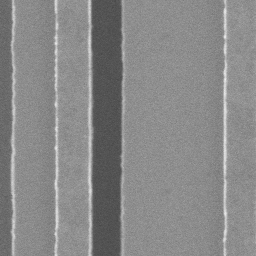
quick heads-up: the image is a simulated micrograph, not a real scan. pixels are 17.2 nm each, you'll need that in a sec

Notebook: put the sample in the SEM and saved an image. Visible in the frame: lines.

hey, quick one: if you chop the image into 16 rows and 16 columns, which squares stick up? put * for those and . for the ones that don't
.*****..********
.*****..********
.*****..********
.*****..********
.*****..********
.*****..********
.*****..********
.*****..********
.*****..********
.*****..********
.*****..********
.*****..********
.*****..********
.*****..********
.*****..********
.*****..********